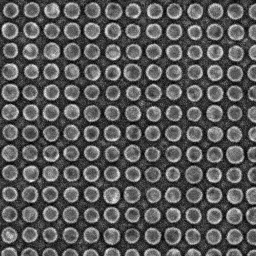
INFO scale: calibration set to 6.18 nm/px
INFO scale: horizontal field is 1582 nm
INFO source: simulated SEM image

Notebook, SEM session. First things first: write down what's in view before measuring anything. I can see a regular array of raised bodies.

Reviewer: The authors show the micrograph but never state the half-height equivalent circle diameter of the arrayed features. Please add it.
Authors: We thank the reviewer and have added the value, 91.8 nm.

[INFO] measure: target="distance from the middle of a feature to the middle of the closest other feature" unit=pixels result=19.9